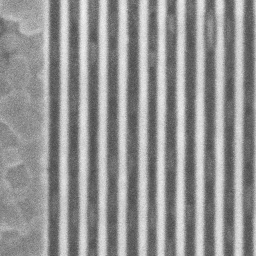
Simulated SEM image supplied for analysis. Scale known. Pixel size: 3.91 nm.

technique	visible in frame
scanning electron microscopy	parallel lines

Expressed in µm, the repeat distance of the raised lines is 0.0763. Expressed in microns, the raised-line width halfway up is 0.0264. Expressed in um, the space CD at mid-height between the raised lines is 0.0499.